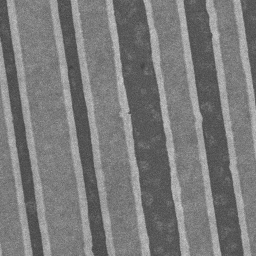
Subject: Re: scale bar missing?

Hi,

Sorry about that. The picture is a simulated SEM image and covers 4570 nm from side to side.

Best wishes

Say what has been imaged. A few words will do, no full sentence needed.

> one or a few lines or trenches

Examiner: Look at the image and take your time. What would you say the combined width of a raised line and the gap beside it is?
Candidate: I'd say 1150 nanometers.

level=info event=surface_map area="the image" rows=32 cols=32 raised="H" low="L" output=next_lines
LHHHHHHLLHHHHHLLLLHHHHHLLLHHHHLL
LHHHHHHLLHHHHHLLLLLHHHHLLLHHHHLL
LLHHHHHLLLHHHHLLLLLHHHHLLLLHHHLL
LLHHHHHLLLHHHHLLLLLHHHHLLLLHHHLL
LLHHHHHLLLHHHHLLLLLHHHHLLLLHHHLL
LLHHHHHLLLHHHHLLLLLHHHHLLLLHHHLL
LLHHHHHHLLHHHHHLLLLLHHHLLLLHHHLL
LLHHHHHHLLHHHHHLLLLLHHHHLLLHHHHL
LLLHHHHHLLHHHHHLLLLLHHHHLLLHHHHL
LLLHHHHHLLLHHHHLLLLLHHHHLLLLHHHL
HLLHHHHHLLLHHHHLLLLLHHHHLLLLHHHL
HLLHHHHHLLLHHHHLLLLLHHHHLLLLHHHL
HLLHHHHHLLLHHHHLLLLLHHHHLLLLHHHL
HLLHHHHHHLLHHHHHLLLLLHHHHLLLHHHH
HLLHHHHHHLLHHHHHLLLLLHHHHLLLHHHH
HLLLHHHHHLLLHHHHLLLLLHHHHLLLHHHH
HLLLHHHHHLLLHHHHLLLLLHHHHLLLLHHH
HHLLHHHHHLLLHHHHLLLLLHHHHLLLLHHH
HHLLHHHHHLLLHHHHLLLLLHHHHLLLLHHH
HHLLHHHHHHLLHHHHHLLLLHHHHLLLLHHH
HHLLHHHHHHLLHHHHHLLLLLHHHHLLLHHH
HHLLHHHHHHLLHHHHHLLLLLHHHHLLLHHH
HHLLLHHHHHLLHHHHHLLLLLHHHHLLLHHH
HHLLLHHHHHLLLHHHHLLLLLHHHHLLLLHH
HHHLLHHHHHLLLHHHHLLLLLHHHHLLLLHH
HHHLLHHHHHLLLHHHHLLLLLHHHHLLLLHH
HHHLLHHHHHHLLHHHHHLLLLHHHHLLLLHH
HHHLLHHHHHHLLHHHHHLLLLLHHHHLLLHH
HHHLLHHHHHHLLHHHHHLLLLLHHHHLLLHH
HHHLLLHHHHHLLLHHHHLLLLLHHHHLLLLH
HHHLLLHHHHHLLLHHHHLLLLLHHHHLLLLH
HHHHLLHHHHHLLLHHHHLLLLLHHHHLLLLH